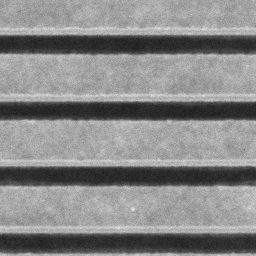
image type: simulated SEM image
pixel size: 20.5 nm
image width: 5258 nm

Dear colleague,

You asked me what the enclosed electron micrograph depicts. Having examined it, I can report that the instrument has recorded lines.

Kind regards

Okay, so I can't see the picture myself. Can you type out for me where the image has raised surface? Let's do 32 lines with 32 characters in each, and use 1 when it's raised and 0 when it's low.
11111111111111111111111111111111
11111111111111111111111111111111
11111111111111111111111111111111
11111111111111111111111111111111
00000000000000000000000000000000
00000000000000000000000000000000
00000000000000000000000000000000
11111111111111111111111111111111
11111111111111111111111111111111
11111111111111111111111111111111
11111111111111111111111111111111
11111111111111111111111111111111
11111111111111111111111111111111
00000000000000000000000000000000
00000000000000000000000000000000
11111111111111111111111111111111
11111111111111111111111111111111
11111111111111111111111111111111
11111111111111111111111111111111
11111111111111111111111111111111
11111111111111111111111111111111
00000000000000000000000000000000
00000000000000000000000000000000
11111111111111111111111111111111
11111111111111111111111111111111
11111111111111111111111111111111
11111111111111111111111111111111
11111111111111111111111111111111
11111111111111111111111111111111
00000000000000000000000000000000
00000000000000000000000000000000
00000000000000000000000000000000